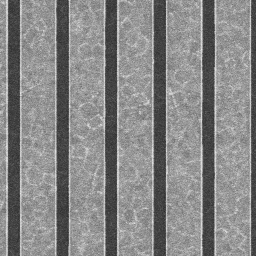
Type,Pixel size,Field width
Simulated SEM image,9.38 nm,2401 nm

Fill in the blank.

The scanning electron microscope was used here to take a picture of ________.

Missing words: parallel lines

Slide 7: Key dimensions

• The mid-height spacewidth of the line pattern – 0.129 microns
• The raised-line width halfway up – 330 nm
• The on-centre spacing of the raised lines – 456 nanometres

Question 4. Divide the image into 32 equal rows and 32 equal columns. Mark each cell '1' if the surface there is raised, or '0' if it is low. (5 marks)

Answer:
10011110011110011110011110011110
10011110011110011110011110011110
10011110011110011110011110011110
10011110011110011110011110011110
10011110011110011110011110011110
10011110011110011110011110011110
10011110011110011110011110011110
10011110011110011110011110011110
10011110011110011110011110011110
10011110011110011110011110011110
10011110011110011110011110011110
10011110011110011110011110011110
10011110011110011110011110011110
10011110011110011110011110011110
10011110011110011110011110011110
10011110011110011110011110011110
10011110011110011110011110011110
10011110011110011110011110011110
10011110011110011110011110011110
10011110011110011110011110011110
10011110011110011110011110011110
10011110011110011110011110011110
10011110011110011110011110011110
10011110011110011110011110011110
10011110011110011110011110011110
10011110011110011110011110011110
10011110011110011110011110011110
10011110011110011110011110011110
10011110011110011110011110011110
10011110011110011110011110011110
10011110011110011110011110011110
10011110011110011110011110011110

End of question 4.